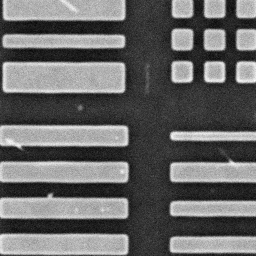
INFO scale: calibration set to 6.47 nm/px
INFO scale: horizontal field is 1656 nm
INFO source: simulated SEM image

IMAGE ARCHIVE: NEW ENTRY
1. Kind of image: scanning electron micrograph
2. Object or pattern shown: groups of lines, slits or small figures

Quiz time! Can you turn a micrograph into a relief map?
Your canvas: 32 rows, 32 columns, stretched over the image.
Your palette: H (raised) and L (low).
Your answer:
HHHHHHHHHHHHHHHHLLLLLLHHLLHHLLHH
HHHHHHHHHHHHHHHHLLLLLLHHLLHHLLHH
LLLLLLLLLLLLLLLLLLLLLLLLLLLLLLLL
LLLLLLLLLLLLLLLLLLLLLLLLLLLLLLLL
LHHHHHHHHHHHHHHLLLLLLLHHLLHHLLHH
HHHHHHHHHHHHHHHLLLLLLLHHLLHHLLHH
LLLLLLLLLLLLLLLLLLLLLLLLLLLLLLLL
LLLLLLLLLLLLLLLLLLLLLLLLLLLLLLLL
HHHHHHHHHHHHHHHLLLLLLLHHLLHHLLHH
HHHHHHHHHHHHHHHLLLLLLLHHLLHHLLHH
HHHHHHHHHHHHHHHLLLLLLLLLLLLLLLLL
LLLHHHHHLHHHHHHLLLLLLLLLLLLLLLLL
LLLLLLLLLLLLLLLLLLLLLLLLLLLLLLLL
LLLLLLLLLLLLLLLLLLLLLLLLLLLLLLLL
LLLLLLLLLLLLLLLLLLLLLLLLLLLLLLLL
LLLLLLLLLLLLLLLLLLLLLLLLLLLLLLLL
HHHHHHHHHHHHHHHHLLLLLLLLLLLLLLLL
HHHHHHHHHHHHHHHHLLLLLLLLLLLLLLLL
LLLLLLLLLLLLLLLLLLLLLLLLLLLLLLLL
LLLLLLLLLLLLLLLLLLLLLLLLLLLLLLLL
HHHHHHHHHHHHHHHHLLLLLLHHHHHHHHHH
HHHHHHHHHHHHHHHHLLLLLHHHHHHHHHHH
HHHHHHHHHHHHHHHHLLLLLLHHHHHHHHHH
LLLLLLLLLLLLLLLLLLLLLLLLLLLLLLLL
LLLLLLLLLLLLLLLLLLLLLLLLLLLLLLLL
HHHHHHHHHHHHHHHHLLLLLHHHHHHHHHHH
HHHHHHHHHHHHHHHHLLLLLHHHHHHHHHHH
LLLLLLLLLLLLLLLLLLLLLLLLLLLLLLLL
LLLLLLLLLLLLLLLLLLLLLLLLLLLLLLLL
HHHHHHHHHHHHHHHHLLLLLLLLLLLLLLLL
HHHHHHHHHHHHHHHHLLLLLHHHHHHHHHHH
HHHHHHHHHHHHHHHHLLLLLLHHHHHHHHHH